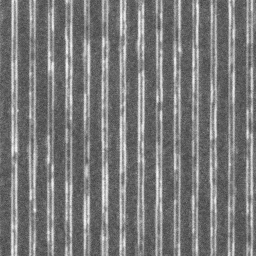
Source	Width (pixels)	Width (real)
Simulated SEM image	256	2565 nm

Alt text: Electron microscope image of parallel lines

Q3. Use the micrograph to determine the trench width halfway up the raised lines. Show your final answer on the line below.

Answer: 126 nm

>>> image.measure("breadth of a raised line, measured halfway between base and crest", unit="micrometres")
0.0564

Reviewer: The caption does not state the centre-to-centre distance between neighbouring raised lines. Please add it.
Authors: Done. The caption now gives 181 nm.